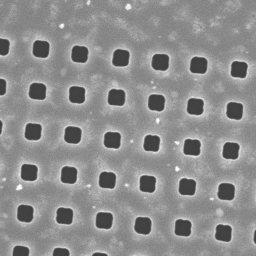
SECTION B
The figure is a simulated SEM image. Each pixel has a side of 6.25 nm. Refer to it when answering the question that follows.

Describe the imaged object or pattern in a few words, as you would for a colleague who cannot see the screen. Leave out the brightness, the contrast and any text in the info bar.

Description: a regular array of holes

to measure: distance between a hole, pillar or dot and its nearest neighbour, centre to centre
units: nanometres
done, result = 246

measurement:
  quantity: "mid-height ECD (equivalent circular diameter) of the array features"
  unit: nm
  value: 113